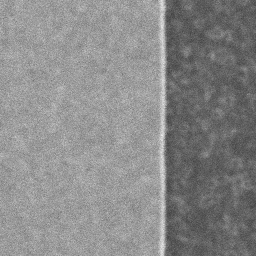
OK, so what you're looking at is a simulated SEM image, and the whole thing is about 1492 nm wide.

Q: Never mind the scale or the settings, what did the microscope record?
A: one or a few lines or trenches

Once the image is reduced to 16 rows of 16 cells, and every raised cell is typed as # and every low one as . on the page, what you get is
##########......
##########......
##########......
##########......
##########......
##########......
##########......
##########......
##########......
##########......
##########......
##########......
##########......
##########......
##########......
##########......